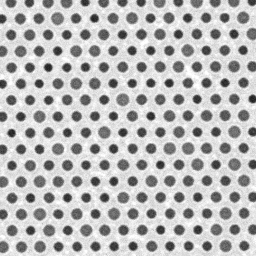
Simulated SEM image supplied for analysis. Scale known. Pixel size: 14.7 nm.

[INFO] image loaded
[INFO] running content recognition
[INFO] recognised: a regular array of holes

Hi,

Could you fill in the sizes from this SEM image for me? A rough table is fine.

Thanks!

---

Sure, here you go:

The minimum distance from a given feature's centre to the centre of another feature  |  271 nm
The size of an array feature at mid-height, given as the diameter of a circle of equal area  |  171 nanometres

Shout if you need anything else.